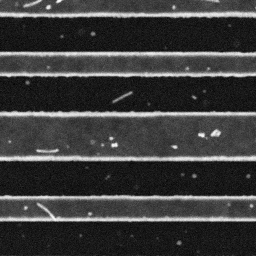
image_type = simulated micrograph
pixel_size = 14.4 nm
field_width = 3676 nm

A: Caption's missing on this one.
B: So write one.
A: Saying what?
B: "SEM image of lines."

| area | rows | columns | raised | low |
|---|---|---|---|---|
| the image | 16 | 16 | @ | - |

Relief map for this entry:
@@@@@@@@@@@@@@@@
----------------
----------------
@@@@@@@@@@@@@@@@
@@@@@@@@@@@@@@@@
----------------
----------------
@@@@@@@@@@@@@@@@
@@@@@@@@@@@@@@@@
@@@@@@@@@@@@@@@@
----------------
----------------
@@@@@@@@@@@@@@@@
@@@@@@@@@@@@@@@@
----------------
----------------